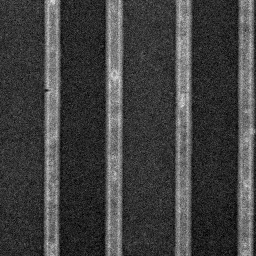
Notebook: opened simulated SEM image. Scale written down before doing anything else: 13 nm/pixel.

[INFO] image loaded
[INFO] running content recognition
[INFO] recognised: one or a few lines or trenches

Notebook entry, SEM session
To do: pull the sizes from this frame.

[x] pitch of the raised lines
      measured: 0.839 micrometres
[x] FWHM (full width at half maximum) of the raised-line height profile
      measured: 159 nm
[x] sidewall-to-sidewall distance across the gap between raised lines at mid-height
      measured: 648 nm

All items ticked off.